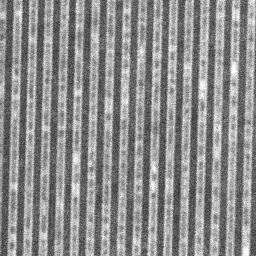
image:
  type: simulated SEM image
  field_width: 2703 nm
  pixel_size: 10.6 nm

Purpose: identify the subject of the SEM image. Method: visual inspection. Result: parallel lines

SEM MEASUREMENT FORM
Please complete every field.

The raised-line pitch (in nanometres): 164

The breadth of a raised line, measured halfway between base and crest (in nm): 73.9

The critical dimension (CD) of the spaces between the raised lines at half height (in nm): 92.4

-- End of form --